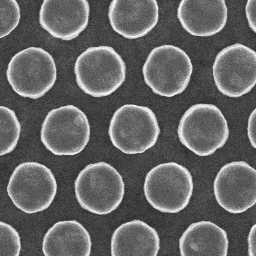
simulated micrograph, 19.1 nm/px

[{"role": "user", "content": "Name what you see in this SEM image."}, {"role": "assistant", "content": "a regular array of raised bodies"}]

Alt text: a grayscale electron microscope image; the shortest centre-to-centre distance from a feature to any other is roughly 1280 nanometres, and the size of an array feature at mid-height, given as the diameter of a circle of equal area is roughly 48.7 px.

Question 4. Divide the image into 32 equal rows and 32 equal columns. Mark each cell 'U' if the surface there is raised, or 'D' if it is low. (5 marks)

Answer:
UUDDDUUUUUUDDDUUUUUUDDDUUUUUDDDU
UUDDDUUUUUUDDDUUUUUUDDUUUUUUDDDU
UUDDDUUUUUUDDDUUUUUUDDUUUUUUDDDU
UUDDDDUUUUDDDDUUUUUDDDDUUUUUDDDD
UDDDDDDUUDDDDDDDUUDDDDDDDDDDDDDD
DDDDDDDDDDDDDDDDDDDDDDDDDDDDDDDD
DDDUUUDDDDDUUUDDDDDUUUUDDDDDUUUU
DUUUUUUDDDUUUUUDDDUUUUUUDDDUUUUU
DUUUUUUDDUUUUUUDDDUUUUUUDDDUUUUU
DUUUUUUDDDUUUUUUDDUUUUUUDDDUUUUU
DUUUUUUDDDUUUUUDDDDUUUUDDDDUUUUU
DDUUUUDDDDDUUUDDDDDDUUUDDDDDUUUD
DDDDDDDDDDDDDDDDDDDDDDDDDDDDDDDD
UDDDDDDUUDDDDDDUUUDDDDDDUUUDDDDD
UUDDDDUUUUUDDDUUUUUDDDDUUUUUDDDU
UUDDDDUUUUUDDDUUUUUUDDDUUUUUDDDU
UUDDDUUUUUUDDDUUUUUUDDDUUUUUDDDU
UUDDDUUUUUUDDDUUUUUDDDDUUUUUDDDU
UUDDDDUUUUDDDDDUUUUDDDDUUUUDDDDD
DDDDDDDDDDDDDDDDDDDDDDDDDDDDDDDD
DDDUUDDDDDDDDDDDDDDDDUDDDDDDDUUD
DDUUUUDDDDUUUUUDDDDUUUUDDDDUUUUU
DUUUUUUDDDUUUUUDDDUUUUUUDDDUUUUU
DUUUUUUDDUUUUUUDDDUUUUUUDDDUUUUU
DUUUUUUDDDUUUUUDDDUUUUUUDDDUUUUU
DDUUUUDDDDUUUUUDDDDUUUUDDDDDUUUU
DDDUDDDDDDDDUUDDDDDDDDDDDDDDDUDD
DDDDDDDDDDDDDDDDDDDDDDDDDDDDDDDD
UDDDDDUUUUDDDDDUUUUDDDDDUUUUDDDD
UUDDDDUUUUUDDDUUUUUUDDDUUUUUDDDU
UUDDDUUUUUUDDDUUUUUUDDDUUUUUDDDU
UUDDDUUUUUUDDDUUUUUUDDDUUUUUDDDU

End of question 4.